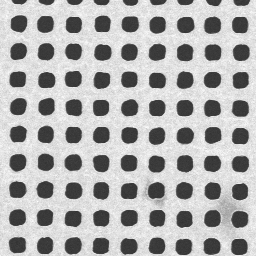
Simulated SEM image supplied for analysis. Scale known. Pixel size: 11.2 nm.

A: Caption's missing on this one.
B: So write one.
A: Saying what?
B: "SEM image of a regular array of holes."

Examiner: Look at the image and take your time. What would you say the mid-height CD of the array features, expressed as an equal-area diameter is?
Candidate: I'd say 17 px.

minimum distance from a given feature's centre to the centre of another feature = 306 nanometers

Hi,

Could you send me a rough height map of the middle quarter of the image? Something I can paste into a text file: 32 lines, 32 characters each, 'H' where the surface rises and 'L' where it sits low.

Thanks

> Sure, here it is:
HHHHHHHHHHHHHHHHHHHHHHHHHHHHHHHH
HHHHHHHHHHHHHHHHHHHHHHHHHHHHHHHH
HLLLHHHHLLLHHHHLLLHHHHLLLHHHHLLL
LLLLLHHHLLLLHHLLLLLHHLLLLHHHLLLL
LLLLHHHHLLLLHHLLLLLHHLLLLHHHLLLL
HLLLHHHHLLLHHHHLLLHHHLLLLHHHLLLL
HHHHHHHHHHHHHHHHHHHHHHHHHHHHHHHH
HHHHHHHHHHHHHHHHHHHHHHHHHHHHHHHH
HHHHHHHHHHHHHHHHHHHHHHHHHHHHHHHH
HLLLHHHLLLLHHHHLLLHHHHLLLHHHLLLL
LLLLLHHLLLLHHHLLLLHHHLLLLHHHLLLL
LLLLHHHLLLLHHHLLLLHHHLLLLHHHLLLL
HLLLHHHHLLLHHHHLLLHHHHLLLHHHLLLL
HHHHHHHHHHHHHHHHHHHHHHHHHHHHHHHH
HHHHHHHHHHHHHHHHHHHHHHHHHHHHHHHH
HHHHHHHHHHHHHHHHHHHHHHHHHHHHHHHH
HLLLHHHHLLLHHHHLLLHHHHLLLHHHHLLL
LLLLHHHLLLLLHHLLLLHHHLLLLHHHLLLL
LLLLHHHLLLLHHHLLLLHHHLLLLHHHLLLL
HLLLHHHHLLHHHHHLLLHHHHLLLHHHHLLL
HHHHHHHHHHHHHHHHHHHHHHHHHHHHHHHH
HHHHHHHHHHHHHHHHHHHHHHHHHHHHHHHH
HHLHHHHHHHHHHHHHHHHHHHHHHHHHHHHH
LLLLHHHLLLLHHHHLLLHHHHLLLHHHHLLL
LLLLLHHLLLLLHHLLLLHHHLLLLHHHLLLL
LLLLHHHLLLLHHHLLLLHHHLLLLHHHLLLL
HLLLHHHHLLLHHHHLLLHHHLLLLHHHHLLL
HHHHHHHHHHHHHHHHHHHHHHHHHHHHHHHH
HHHHHHHHHHHHHHHHHHHHHHHHHHHHHHHH
HHHHHHHHHHHHHHHHHHHHHHHLHHHHHHHH
HLLLHHHLLLLHHHHLLLHHHLLLLHHHLLLL
LLLLLHHLLLLHHHLLLLHHHLLLLHHHLLLL